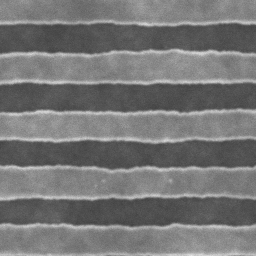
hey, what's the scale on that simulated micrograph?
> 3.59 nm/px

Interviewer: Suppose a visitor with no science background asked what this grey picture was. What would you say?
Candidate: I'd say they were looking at lines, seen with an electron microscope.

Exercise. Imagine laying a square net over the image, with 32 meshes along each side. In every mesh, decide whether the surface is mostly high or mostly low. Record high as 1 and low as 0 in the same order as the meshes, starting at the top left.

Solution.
11111111111111111111111111111111
11111111111111111111111111111111
11111111111111111111111111111111
00000000000000000000000000000000
00000000000000000000000000000000
00000000000000000000000000000000
00000000000000110111111100110000
11111111111111111111111111111111
11111111111111111111111111111111
11111111111111111111111111111111
00000000000000000000000000000000
00000000000000000000000000000000
00000000000000000000000000000000
00000000000000000000000000000000
11111111111111111111111111111111
11111111111111111111111111111111
11111111111111111111111111111111
00011111110011001111111000100000
00000000000000000000000000000000
00000000000000000000000000000000
00000000000000000000000000000000
11111111111111111111111111111111
11111111111111111111111111111111
11111111111111111111111111111111
11111111111111111111111011001111
00000000000000000000000000000000
00000000000000000000000000000000
00000000000000000000000000000000
11111111111111111111111111111111
11111111111111111111111111111111
11111111111111111111111111111111
11111111111111111111111111111111